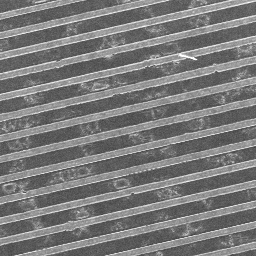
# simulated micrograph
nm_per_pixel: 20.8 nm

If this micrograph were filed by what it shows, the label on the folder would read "parallel lines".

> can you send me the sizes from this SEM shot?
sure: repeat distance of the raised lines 20.1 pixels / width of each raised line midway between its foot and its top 124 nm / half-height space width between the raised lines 282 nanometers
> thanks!